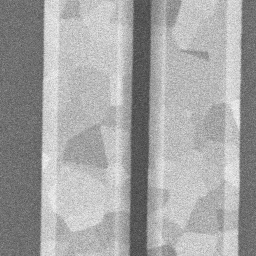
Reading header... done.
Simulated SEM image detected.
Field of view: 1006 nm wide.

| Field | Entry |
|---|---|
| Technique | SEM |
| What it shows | one or a few lines or trenches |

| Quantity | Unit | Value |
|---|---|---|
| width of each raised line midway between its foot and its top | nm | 288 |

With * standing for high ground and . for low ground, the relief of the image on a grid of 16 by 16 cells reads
...*****..*****.
...*****..*****.
...*****..*****.
...*****..*****.
...*****..****..
...*****..****..
...*****..****..
...*****..****..
...*****..****..
...*****..****..
...*****..****..
...*****..****..
...*****..****..
...*****..****..
...*****..****..
...*****..****..